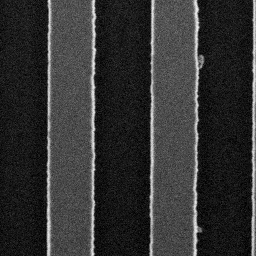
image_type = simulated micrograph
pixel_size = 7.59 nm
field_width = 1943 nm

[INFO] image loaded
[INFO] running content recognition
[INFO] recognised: lines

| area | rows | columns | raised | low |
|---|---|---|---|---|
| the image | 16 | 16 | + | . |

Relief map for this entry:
...+++...+++....
...+++...+++....
...+++...+++....
...+++...+++....
...+++...+++....
...+++...+++....
...+++...+++....
...+++...+++....
...+++...+++....
...+++...+++....
...+++...+++....
...+++...+++....
...+++...+++....
...+++...+++....
...+++...+++....
...+++...+++....